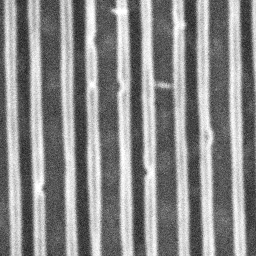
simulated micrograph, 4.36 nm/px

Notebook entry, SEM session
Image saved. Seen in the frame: parallel lines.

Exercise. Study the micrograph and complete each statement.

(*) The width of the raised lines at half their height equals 33.3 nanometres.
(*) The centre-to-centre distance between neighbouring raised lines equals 122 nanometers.